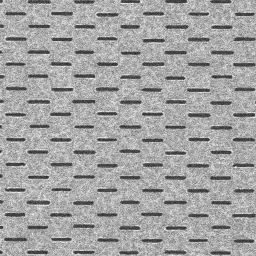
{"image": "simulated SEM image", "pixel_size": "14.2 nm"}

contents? a regular array of holes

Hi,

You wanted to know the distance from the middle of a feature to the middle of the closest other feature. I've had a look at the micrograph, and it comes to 350 nanometres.